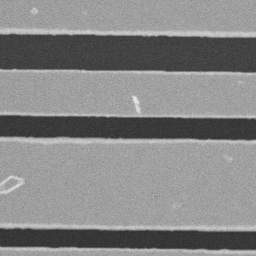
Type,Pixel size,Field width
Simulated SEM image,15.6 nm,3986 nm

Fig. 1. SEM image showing lines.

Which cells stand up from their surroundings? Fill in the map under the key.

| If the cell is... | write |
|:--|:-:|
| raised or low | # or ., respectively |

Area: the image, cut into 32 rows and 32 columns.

################################
################################
################################
################################
................................
................................
................................
................................
................................
################################
################################
################################
################################
################################
.............###################
................................
................................
##################.#...##.......
################################
################################
################################
################################
################################
################################
################################
################################
################################
################################
.........##.####################
................................
................................
################################